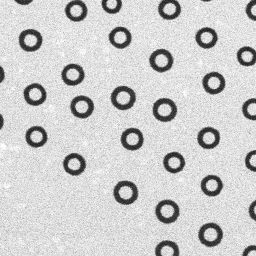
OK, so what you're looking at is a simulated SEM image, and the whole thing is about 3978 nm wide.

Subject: a regular array of ring-shaped grooves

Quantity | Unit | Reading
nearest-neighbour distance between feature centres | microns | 0.688